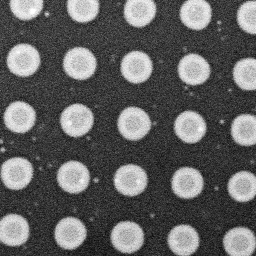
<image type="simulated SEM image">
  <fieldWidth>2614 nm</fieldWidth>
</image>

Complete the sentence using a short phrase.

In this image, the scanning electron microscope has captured an array of small figures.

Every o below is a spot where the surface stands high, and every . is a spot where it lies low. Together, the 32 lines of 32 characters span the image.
.oooo...oooo....ooo....ooo....oo
..ooo....ooo....ooo....ooo....oo
.........oo.....ooo....ooo....oo
........................o.....oo
................................
................................
.oooo....oo.....oo..............
.oooo...oooo...oooo....ooo....oo
.oooo...oooo...oooo...oooo...ooo
.........oo....oooo...oooo...ooo
........................o.....oo
................................
................................
.ooo....ooo.....o...............
.ooo....oooo...oooo...ooo.....oo
.ooo....oooo...oooo...oooo...ooo
..o.....ooo....ooo....oooo...ooo
.......................oo....ooo
................................
................................
oooo....oo......................
oooo...oooo....ooo....ooo.....o.
oooo...oooo...oooo...oooo....ooo
.oo.....ooo....ooo....ooo....ooo
......................oo.....ooo
................................
................................
ooo.....oo......................
oooo...oooo...oooo....oo.....oo.
oooo...oooo...oooo...oooo...oooo
.oo....ooo....oooo...oooo...oooo
...............oo.....oo....oooo